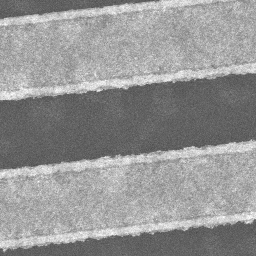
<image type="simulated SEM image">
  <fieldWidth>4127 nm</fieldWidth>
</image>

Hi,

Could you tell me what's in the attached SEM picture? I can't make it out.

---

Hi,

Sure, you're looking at one or a few lines or trenches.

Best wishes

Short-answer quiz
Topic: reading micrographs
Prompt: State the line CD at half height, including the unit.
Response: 1140 nm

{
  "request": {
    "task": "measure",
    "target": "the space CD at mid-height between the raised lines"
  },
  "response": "1260 nm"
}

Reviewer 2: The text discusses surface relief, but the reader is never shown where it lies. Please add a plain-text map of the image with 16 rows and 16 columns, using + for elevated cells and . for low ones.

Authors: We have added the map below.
........++++++++
++++++++++++++++
++++++++++++++++
++++++++++++++++
+++++++++++++...
++++............
................
................
................
.............+++
....++++++++++++
++++++++++++++++
++++++++++++++++
++++++++++++++++
+++++++.........
................